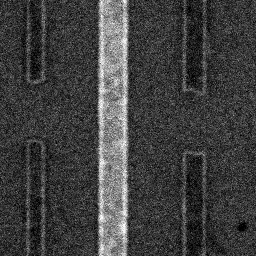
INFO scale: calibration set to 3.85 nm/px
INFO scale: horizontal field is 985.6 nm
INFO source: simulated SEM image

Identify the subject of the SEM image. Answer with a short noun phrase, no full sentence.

one or a few lines or trenches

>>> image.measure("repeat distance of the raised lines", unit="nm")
306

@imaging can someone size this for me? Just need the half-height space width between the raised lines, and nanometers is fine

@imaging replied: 225